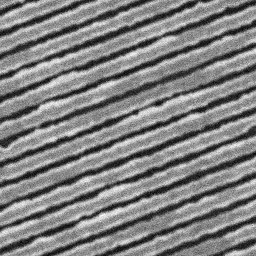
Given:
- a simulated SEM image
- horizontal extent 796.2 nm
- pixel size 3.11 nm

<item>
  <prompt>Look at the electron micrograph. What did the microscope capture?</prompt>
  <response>parallel lines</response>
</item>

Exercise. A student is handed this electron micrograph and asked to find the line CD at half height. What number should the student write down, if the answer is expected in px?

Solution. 13.2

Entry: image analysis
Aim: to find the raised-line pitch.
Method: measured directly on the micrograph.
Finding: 63.2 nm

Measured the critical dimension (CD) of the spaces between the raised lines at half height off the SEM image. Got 21.8 nanometers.